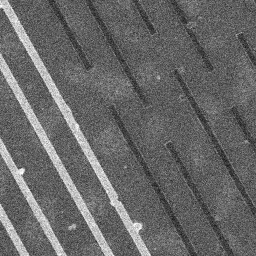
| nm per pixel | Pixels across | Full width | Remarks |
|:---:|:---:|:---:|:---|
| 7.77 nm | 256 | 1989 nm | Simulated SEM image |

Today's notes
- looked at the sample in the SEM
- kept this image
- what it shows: parallel lines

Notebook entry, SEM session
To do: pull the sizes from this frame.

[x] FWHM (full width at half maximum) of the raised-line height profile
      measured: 58.4 nm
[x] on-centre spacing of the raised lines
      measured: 37.1 px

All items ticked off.